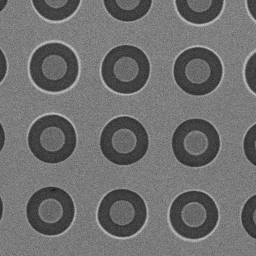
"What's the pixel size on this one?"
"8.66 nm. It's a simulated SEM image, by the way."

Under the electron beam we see an array of small figures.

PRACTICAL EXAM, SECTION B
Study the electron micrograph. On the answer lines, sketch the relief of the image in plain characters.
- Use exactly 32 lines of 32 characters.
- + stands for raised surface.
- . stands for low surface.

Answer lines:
.+++......+++......+++..++..+++.
+++++....++++.....++++......+++.
++++++..+++++++..++++++....+++++
++++++++++++++++++++++++++++++++
++++++++++++++++++++++++++++++++
+++++...++++++++++++++++++++++++
++++.....+++++....+++++....+++++
.+++......+++......+++......+++.
.+++......+++......+++......+++.
.+++......+++......+++......+++.
++++.....++++.....++++.....++++.
++++++..++++++...++++++...++++++
++++++++++++++++++++++++++++++++
++++++++++++++++++++++++++++++++
+++++...+++++++.++++++++++++++++
++++.....++++.....+++++...++++++
.+++.....++++.....++++.....++++.
.++.......+++......+++......++..
++++.....++++......+++......++..
++++.....++++.....++++.....++++.
++++++++++++++...++++++...++++++
++++++++++++++++++++++++++++++++
++++++++++++++++++++++++++++++++
+++++..+++++++++++++++++++++++++
++++.....++++....+++++....++++++
+++......+++......+++...+..++++.
+++......+++......+++..+++.+++..
+++......+++......+++..+++.+++..
++++.....++++.....+++......+++..
++++++.+++++++...+++++....+++++.
++++++++++++++++++++++++++++++++
++++++++++++++++++++++++++++++++